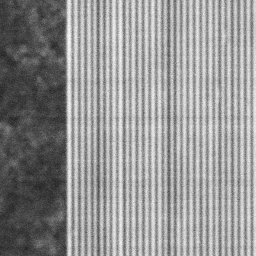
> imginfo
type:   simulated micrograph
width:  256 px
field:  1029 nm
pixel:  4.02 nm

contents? parallel lines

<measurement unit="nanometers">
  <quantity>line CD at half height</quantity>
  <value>14.6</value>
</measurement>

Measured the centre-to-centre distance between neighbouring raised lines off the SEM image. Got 25.7 nm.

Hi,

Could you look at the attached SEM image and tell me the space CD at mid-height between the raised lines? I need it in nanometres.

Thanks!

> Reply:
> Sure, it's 11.